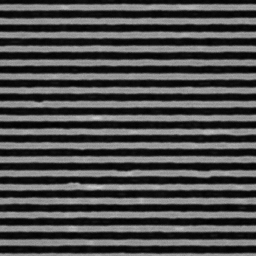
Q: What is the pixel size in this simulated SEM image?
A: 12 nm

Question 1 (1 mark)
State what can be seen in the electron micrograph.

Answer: parallel lines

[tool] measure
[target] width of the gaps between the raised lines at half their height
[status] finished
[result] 7.75 px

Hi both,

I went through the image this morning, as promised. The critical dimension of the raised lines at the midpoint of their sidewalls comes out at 73.7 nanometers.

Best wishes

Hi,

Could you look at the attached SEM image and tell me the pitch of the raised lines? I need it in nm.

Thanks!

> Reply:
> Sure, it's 167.